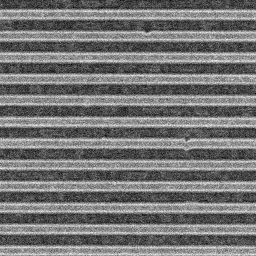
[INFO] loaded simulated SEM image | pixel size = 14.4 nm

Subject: parallel lines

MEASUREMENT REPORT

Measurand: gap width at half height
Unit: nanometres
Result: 177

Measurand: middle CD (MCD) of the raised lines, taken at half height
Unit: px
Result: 9.5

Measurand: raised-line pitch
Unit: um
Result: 0.31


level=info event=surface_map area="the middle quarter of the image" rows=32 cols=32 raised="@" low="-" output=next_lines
--------------------------------
--------------------------------
--------------------------------
@@@@@@@@@@@@@@@@@@@@@@@@@@@@@@@@
@@@@@@@@@@@@@@@@@@@@@@@@@@@@@@@@
--------------------------------
--------------------------------
--------------------------------
@@@@@@@@@@@@@@@@@@@@@@@@@@@@@@@@
@@@@@@@@@@@@@@@@@@@@@@@@@@@@@@@@
--------------------------------
--------------------------------
--------------------------------
@@@@@@@@@@@@@@@@@@@@------------
@@@@@@@@@@@@@@@@@@@@@@@@@@@@@@@@
@@@@@@@@@@@@@@@@@@@@@@@@@@@@@@@@
--------------------------------
--------------------------------
--------------------------------
@@@@@@@@@@@@@@@@@@@@@@@@@@@@@@@@
@@@@@@@@@@@@@@@@@@@@@@@@@@@@@@@@
--------------------------------
--------------------------------
--------------------------------
@@@@@@@@@@@@@@@@@@@@@@@@@@@@@@@@
@@@@@@@@@@@@@@@@@@@@@@@@@@@@@@@@
--------------------------------
--------------------------------
--------------------------------
--------------------------------
@@@@@@@@@@@@@@@@@@@@@@@@@@@@@@@@
@@@@@@@@@@@@@@@@@@@@@@@@@@@@@@@@